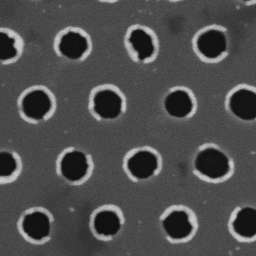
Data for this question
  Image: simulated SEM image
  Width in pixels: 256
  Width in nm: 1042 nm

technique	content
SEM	a regular array of holes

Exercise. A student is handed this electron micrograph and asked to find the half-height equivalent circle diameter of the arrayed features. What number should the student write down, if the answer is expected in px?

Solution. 27.1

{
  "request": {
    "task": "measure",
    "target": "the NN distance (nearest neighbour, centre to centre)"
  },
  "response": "280 nm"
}